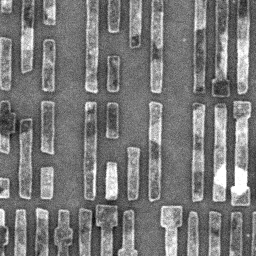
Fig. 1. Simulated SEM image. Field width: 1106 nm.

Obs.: wiring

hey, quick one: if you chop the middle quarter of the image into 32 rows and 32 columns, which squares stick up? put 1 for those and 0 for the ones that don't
00000011000111000000001100000000
00000011000111000000001100000000
00000011000111000000001100000000
00000011000111000000001100000000
00000011000111000000001100000000
00000011000111000000001100000000
00000011000110000000001100000000
00000000000000000000000000000000
00000000000000000000000000000000
00000000000000000000000000000000
00000011000110000000001100000000
00000011000110000000001100000000
00000011000110000000001100000000
00000011000110000000001100000000
00000111000110000000001100000000
00000111000110000000001100000000
00000111000110000000001100000000
00000111000110000000001100000000
00000111000000000000001100000000
00000111000000000000001100000000
00000111000000000000001100000000
00000111000000001110001100000000
00000111000000001110001100000000
00000111000000001110001100000000
00000111000000001100001100000000
00000111000110001100001100000000
00000111000110001100001100000000
00000111000110001100001100000000
00000111000110001110001100000000
00000111000110001100001100000000
00000111000110001100001100000000
00000111000110001100001100000000